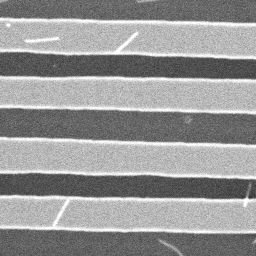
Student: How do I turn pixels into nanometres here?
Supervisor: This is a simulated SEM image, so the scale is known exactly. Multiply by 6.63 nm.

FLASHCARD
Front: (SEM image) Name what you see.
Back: lines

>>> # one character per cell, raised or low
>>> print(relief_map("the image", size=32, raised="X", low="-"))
--------------------------------
--------------------------------
XXXXXX-XXX----------------------
XXXXXXXXXXXXXXXXXXXXXXXXXXXXXXXX
XXXXXXXXXXXXXXXXXXXXXXXXXXXXXXXX
XXXXXXXXXXXXXXXXXXXXXXXXXXXXXXXX
---XXXXXXXXXXXXXXXXXXXXXXXXXXXXX
--------------------------------
--------------------------------
--------------------------------
XXXXXXXXXXXXXXXXXXXXXXXXXXXXXXXX
XXXXXXXXXXXXXXXXXXXXXXXXXXXXXXXX
XXXXXXXXXXXXXXXXXXXXXXXXXXXXXXXX
---XXXXXXXXXXXXXXXXXXXXXXXXXXXXX
--------------------------------
--------------------------------
--------------------------------
XXXXXXXXXX----------------------
XXXXXXXXXXXXXXXXXXXXXXXXXXXXXXXX
XXXXXXXXXXXXXXXXXXXXXXXXXXXXXXXX
XXXXXXXXXXXXXXXXXXXXXXXXXXXXXXXX
XXXXXXXXXXXXXXXXXXXXXXXXXXXXXXXX
--------------------------------
--------------------------------
-X------------------------------
XXXXXXXXXXXXXXXXXXXXXXXXXXXXXXXX
XXXXXXXXXXXXXXXXXXXXXXXXXXXXXXXX
XXXXXXXXXXXXXXXXXXXXXXXXXXXXXXXX
XXXXXXXXXXXXXXXXXXXXXXXXXXXXXXXX
--------------------------------
--------------------------------
--------------------------------